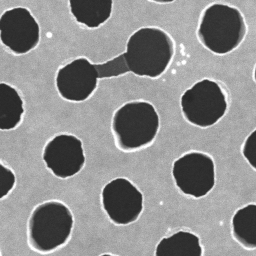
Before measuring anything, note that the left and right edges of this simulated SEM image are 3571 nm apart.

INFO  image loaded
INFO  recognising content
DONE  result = holes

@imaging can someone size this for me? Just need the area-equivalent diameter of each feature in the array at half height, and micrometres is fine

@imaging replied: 0.621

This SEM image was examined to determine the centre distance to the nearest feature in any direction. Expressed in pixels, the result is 71.2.